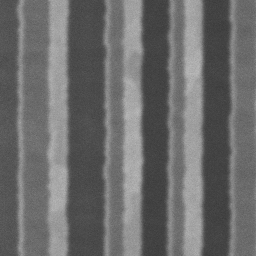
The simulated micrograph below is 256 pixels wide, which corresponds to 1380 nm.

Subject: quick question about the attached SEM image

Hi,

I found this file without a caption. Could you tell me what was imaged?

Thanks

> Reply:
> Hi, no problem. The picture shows lines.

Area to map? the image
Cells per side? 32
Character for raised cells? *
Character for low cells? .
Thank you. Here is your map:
...*****.....*****...****....***
..******.....*****...****....***
...*****.....*****...****....***
...*****.....*****...****....***
...*****.....****....****....***
..******.....*****...****....***
..******......****...****....***
..******.....*****...****....***
..******.....****....****....***
..******.....****....****....***
..******.....****....****....***
..******.....*****...****....***
..******.....*****...****....***
..******.....*****...****....***
..******.....*****...****....***
..******.....****....****....***
..******......***....****....***
..******.....*****...****....***
..******.....*****...****....***
...*****.....*****...****....***
...*****.....*****...****....***
..******.....*****...****....***
..******.....*****...****....***
..******.....****....****....***
..******.....*****...****....***
...*****.....****....****....***
..******.....****....****....***
..******.....****....****....***
...*****.....*****...****....***
...*****.....****....****....***
..******.....*****...****....***
...*****.....****....****....***